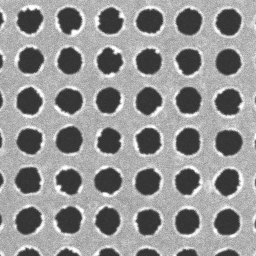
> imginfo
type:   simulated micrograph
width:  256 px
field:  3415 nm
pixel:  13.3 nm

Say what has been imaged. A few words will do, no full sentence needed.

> a regular array of holes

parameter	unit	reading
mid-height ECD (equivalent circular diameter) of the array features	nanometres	360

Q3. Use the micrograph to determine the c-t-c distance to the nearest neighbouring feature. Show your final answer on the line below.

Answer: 0.524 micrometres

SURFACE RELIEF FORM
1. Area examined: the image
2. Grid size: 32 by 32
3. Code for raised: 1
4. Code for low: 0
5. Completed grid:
11111111111111111111111111111111
11000110001110011100111001110011
11000110001100011000110001100011
11000111001100011000110001100011
11111111111111111111111111111111
11111111111111111111111111111111
11100111001110011100110001100011
11000010001100011000110001100011
11000110001100011000110001100011
11111111111111111111111111111111
11111111111111111111111111111111
11100111001100011000110001110011
11000110001100011000110001100011
11000110001100011000110001100011
11111111111111111111111111111111
11111111111111111111111111111111
11100110001110011000110001100011
11000110001100011000110001100011
11000110001100011000110001100011
11111111111111111111111111111111
11111111111111111111111111111111
11000110001100011000110001110011
11000110001100011000110001100011
11000110001100011000110001100011
11111111111111111111111111110111
11111111111111111111111111111111
11000110001100011000110001100011
11000110001100011000110001100011
11000110001100011000110001100011
11111111111111111111111111111111
11111111111111111111111111111111
11000110011100011000110001100011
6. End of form